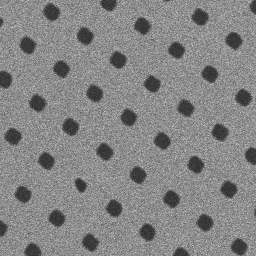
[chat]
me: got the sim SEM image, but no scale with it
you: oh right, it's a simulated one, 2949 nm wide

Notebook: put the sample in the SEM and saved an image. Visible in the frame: a regular array of holes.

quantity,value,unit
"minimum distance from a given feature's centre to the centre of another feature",0.471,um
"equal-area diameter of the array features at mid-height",195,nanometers